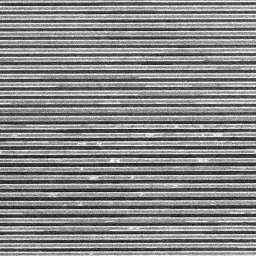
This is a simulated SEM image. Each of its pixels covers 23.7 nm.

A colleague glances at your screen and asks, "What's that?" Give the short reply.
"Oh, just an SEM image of parallel lines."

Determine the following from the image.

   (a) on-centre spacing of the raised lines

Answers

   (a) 201 nanometres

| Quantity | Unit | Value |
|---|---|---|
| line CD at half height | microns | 0.112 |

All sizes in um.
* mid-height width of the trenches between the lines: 0.0888